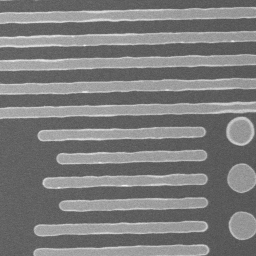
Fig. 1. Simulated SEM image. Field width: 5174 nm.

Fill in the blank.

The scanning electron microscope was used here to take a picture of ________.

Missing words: groups of lines, slits or small figures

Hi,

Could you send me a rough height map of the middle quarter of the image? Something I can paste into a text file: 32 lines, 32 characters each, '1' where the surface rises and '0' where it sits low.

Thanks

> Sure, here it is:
11111111111111111111111111111111
00000000000000000000000000000000
00000000000000000000000000000000
00000000000000000000000000000000
00000000000000000111111111111111
11111111111111111111111111111111
11111111111111111111111111111100
00000000000000000000000000000000
00000000000000000000000000000000
00000000000000000000000000000000
00000000000000000111111111111111
11111111111111111111111111111111
11111111111111111111111111011100
00000000000000000000000000000000
00000000000000000000000000000000
00000000000000000000000000000000
00000000000011000011111111111111
11111111111111111111111111111111
11111111111111000000000000000000
00000000000000000000000000000000
00000000000000000000000000000000
00000000000000000000000000000000
10111011111111111111111111111111
11111111111111111111111111111111
11111111111111100000000000000000
00000000000000000000000000000000
00000000000000000000000000000000
00000000000000000000000000000000
11111111111111111111111111111111
11111111111111111111111111111111
11111110000000000000000000000000
00000000000000000000000000000000